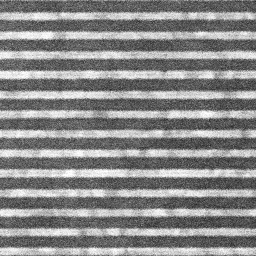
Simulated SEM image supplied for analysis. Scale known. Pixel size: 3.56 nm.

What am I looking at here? parallel lines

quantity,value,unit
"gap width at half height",48.5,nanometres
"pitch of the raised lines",70.1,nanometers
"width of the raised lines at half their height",0.0209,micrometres